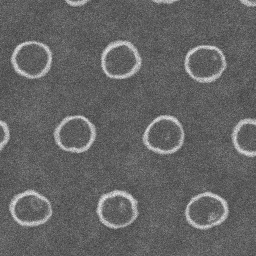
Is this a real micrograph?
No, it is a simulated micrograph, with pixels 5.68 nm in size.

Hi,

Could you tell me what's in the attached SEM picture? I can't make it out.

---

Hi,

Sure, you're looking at a regular array of raised bodies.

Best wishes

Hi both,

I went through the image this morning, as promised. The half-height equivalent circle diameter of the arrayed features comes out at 210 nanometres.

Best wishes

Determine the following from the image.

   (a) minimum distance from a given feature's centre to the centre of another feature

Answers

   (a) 490 nm